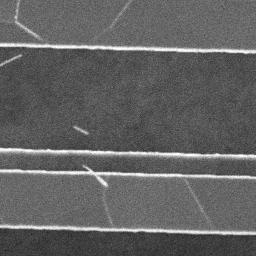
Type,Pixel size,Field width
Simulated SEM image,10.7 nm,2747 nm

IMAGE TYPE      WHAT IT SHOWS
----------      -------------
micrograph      lines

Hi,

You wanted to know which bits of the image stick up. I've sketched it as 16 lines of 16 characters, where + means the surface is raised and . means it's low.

++++++++++++++++
++++++++++++++++
++++++++++++++++
................
................
................
................
................
................
................
................
++++++++++++++++
++++++++++++++++
++++++++++++++++
...........+++++
................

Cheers